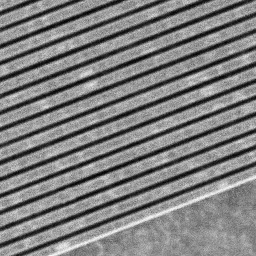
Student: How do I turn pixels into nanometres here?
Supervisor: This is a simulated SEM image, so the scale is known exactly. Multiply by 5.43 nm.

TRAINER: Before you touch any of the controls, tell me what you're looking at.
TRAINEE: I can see parallel lines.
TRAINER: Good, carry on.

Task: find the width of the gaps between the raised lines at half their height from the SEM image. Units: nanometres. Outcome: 29.2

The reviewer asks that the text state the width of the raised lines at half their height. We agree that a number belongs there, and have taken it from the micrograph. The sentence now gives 53.8 nanometers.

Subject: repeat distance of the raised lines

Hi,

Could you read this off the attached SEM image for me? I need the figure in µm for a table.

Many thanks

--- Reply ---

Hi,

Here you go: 0.0841